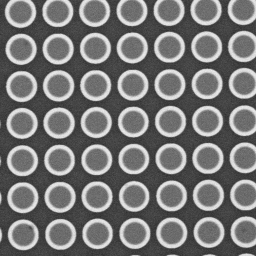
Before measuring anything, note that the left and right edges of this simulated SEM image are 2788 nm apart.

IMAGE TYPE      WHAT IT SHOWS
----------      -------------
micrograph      an array of small figures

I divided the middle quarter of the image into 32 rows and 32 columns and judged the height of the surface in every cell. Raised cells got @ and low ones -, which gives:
--------------------------------
-------------------------@@@----
@----@@@@@----@@@@@@----@@@@@---
@@---@@@@@@---@@@@@@@--@@@@@@@--
@@--@@@@@@@@--@@@@@@@--@@@@@@@--
@@--@@@@@@@@--@@@@@@@--@@@@@@@--
@@--@@@@@@@@--@@@@@@@--@@@@@@@--
@@---@@@@@@---@@@@@@---@@@@@@---
@-----@@@@-----@@@@------@@@----
--------------------------------
--------------------------------
@-----@@@@-----@@@@@----@@@@@---
@@---@@@@@@---@@@@@@@--@@@@@@@--
@@--@@@@@@@@--@@@@@@@--@@@@@@@--
@@@-@@@@@@@@--@@@@@@@--@@@@@@@--
@@@-@@@@@@@@--@@@@@@@--@@@@@@@--
@@---@@@@@@---@@@@@@---@@@@@@@--
@-----@@@@-----@@@@@----@@@@@---
--------------------------------
--------------------------------
-------@@@------@@@------@@@@---
@@---@@@@@@---@@@@@@@---@@@@@@--
@@---@@@@@@@--@@@@@@@--@@@@@@@--
@@@-@@@@@@@@--@@@@@@@--@@@@@@@--
@@@-@@@@@@@@--@@@@@@@--@@@@@@@--
@@---@@@@@@@--@@@@@@@--@@@@@@@--
@@---@@@@@@----@@@@@----@@@@@---
@------@@@----------------------
--------------------------------
-----------------@-------@@@----
@@----@@@@@----@@@@@----@@@@@@--
@@---@@@@@@@--@@@@@@@--@@@@@@@--